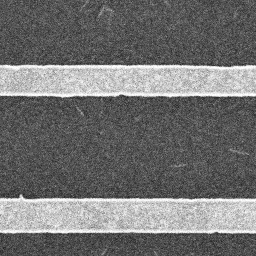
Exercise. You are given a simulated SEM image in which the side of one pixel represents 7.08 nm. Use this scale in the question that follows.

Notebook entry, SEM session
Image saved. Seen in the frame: one or a few lines or trenches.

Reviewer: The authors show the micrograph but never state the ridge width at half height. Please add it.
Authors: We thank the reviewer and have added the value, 215 nm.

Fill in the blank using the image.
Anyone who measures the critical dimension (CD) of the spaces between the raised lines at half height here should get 105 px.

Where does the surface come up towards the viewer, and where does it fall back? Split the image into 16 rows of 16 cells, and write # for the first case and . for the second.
................
................
................
................
################
################
................
................
................
................
................
................
##.#############
################
..###.........##
................